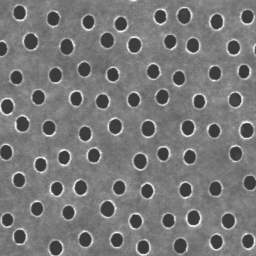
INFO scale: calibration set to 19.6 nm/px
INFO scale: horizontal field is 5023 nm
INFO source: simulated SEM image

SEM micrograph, a regular array of holes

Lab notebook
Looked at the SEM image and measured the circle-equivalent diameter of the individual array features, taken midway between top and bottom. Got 263 nm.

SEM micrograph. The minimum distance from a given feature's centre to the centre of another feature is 521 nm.